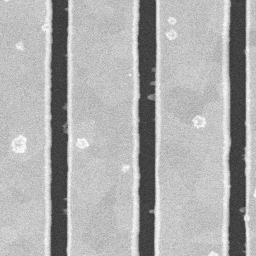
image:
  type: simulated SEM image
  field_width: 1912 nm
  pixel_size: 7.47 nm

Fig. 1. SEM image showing lines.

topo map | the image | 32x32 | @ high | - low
@@@@@@---@@@@@@@@---@@@@@@@@@--@
@@@@@@---@@@@@@@@---@@@@@@@@@--@
@@@@@@---@@@@@@@@---@@@@@@@@@--@
@@@@@@---@@@@@@@@---@@@@@@@@@--@
@@@@@@---@@@@@@@@---@@@@@@@@---@
@@@@@@--@@@@@@@@@---@@@@@@@@---@
@@@@@@--@@@@@@@@@---@@@@@@@@---@
@@@@@@--@@@@@@@@@---@@@@@@@@---@
@@@@@@---@@@@@@@@---@@@@@@@@---@
@@@@@@--@@@@@@@@@---@@@@@@@@---@
@@@@@@--@@@@@@@@@--@@@@@@@@@@--@
@@@@@@--@@@@@@@@@--@@@@@@@@@@--@
@@@@@@--@@@@@@@@@--@@@@@@@@@@--@
@@@@@@--@@@@@@@@@--@@@@@@@@@@--@
@@@@@@--@@@@@@@@@--@@@@@@@@@@--@
@@@@@@---@@@@@@@@--@@@@@@@@@---@
@@@@@@---@@@@@@@@--@@@@@@@@@@--@
@@@@@@---@@@@@@@@---@@@@@@@@@--@
@@@@@@--@@@@@@@@@--@@@@@@@@@@--@
@@@@@@--@@@@@@@@@--@@@@@@@@@---@
@@@@@@--@@@@@@@@@--@@@@@@@@@---@
@@@@@@--@@@@@@@@@--@@@@@@@@@@--@
@@@@@@--@@@@@@@@@--@@@@@@@@@@--@
@@@@@@--@@@@@@@@@--@@@@@@@@@@--@
@@@@@@--@@@@@@@@@--@@@@@@@@@@--@
@@@@@@--@@@@@@@@@--@@@@@@@@@---@
@@@@@@--@@@@@@@@@--@@@@@@@@@---@
@@@@@@--@@@@@@@@@--@@@@@@@@@---@
@@@@@@--@@@@@@@@@--@@@@@@@@@---@
@@@@@@--@@@@@@@@@--@@@@@@@@@---@
@@@@@@--@@@@@@@@@--@@@@@@@@@---@
@@@@@@--@@@@@@@@@--@@@@@@@@@---@